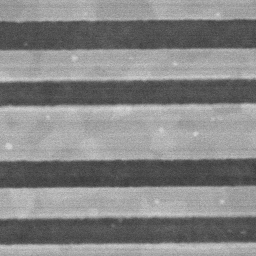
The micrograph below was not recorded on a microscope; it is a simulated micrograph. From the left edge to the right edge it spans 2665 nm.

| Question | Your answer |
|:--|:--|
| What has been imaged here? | lines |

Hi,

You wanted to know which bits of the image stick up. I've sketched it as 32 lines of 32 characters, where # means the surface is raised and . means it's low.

################################
################################
#################.#.............
................................
................................
................................
################################
################################
################################
################################
................................
................................
................................
################################
################################
################################
################################
################################
################################
################################
................................
................................
................................
................################
################################
################################
################################
................................
................................
................................
....................####..######
################################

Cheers